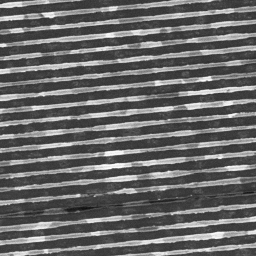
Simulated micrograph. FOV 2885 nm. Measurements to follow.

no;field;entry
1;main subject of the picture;parallel lines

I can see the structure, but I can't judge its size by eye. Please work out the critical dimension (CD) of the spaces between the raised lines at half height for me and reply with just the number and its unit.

109 nanometres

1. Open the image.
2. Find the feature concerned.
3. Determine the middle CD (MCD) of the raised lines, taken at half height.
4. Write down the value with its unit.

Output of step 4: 0.0322 microns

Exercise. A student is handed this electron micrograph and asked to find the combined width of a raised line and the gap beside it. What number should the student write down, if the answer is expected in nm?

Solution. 147